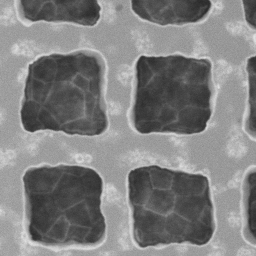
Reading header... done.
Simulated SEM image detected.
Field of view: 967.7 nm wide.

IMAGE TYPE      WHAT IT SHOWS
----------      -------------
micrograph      holes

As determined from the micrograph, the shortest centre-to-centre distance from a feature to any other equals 402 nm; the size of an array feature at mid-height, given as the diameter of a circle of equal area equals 327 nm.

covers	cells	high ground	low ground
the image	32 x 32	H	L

HHLLLLLLLLLLHHHHLLLLLLLLLLHHHHLL
HHLLLLLLLLLLHHHHHLLLLLLLLLHHHHHL
HHHHLLLLLLLLHHHHHHLLLLLLLHHHHHHL
HHHHHHHHHHHHHHHHHHHHHHHHHHHHHHHH
HHHHHHHHHHHHHHHHHHHHHHHHHHHHHHHH
HHHHHHHHHHHHHHHHHHHHHHHHHHHHHHHH
HHHHHHHHHLLHHHHHHHHHHHHHHHHHHHHH
HHHHHLLLLLLLLHHHHLLLLLLLLLHHHHHL
HHHHLLLLLLLLLHHHHLLLLLLLLLHHHHHL
HHHLLLLLLLLLLHHHHLLLLLLLLLLHHHHL
HHHLLLLLLLLLLHHHHLLLLLLLLLHHHHHL
HHHLLLLLLLLLLHHHHLLLLLLLLLHHHHHL
HHHLLLLLLLLLLHHHHLLLLLLLLLHHHHHL
HHHLLLLLLLLLLHHHHLLLLLLLLLHHHHHL
HHHLLLLLLLLLLHHHHLLLLLLLLLHHHHHL
HHHLLLLLLLLLLLHHHLLLLLLLLLHHHHHL
HHHHHHHHLLLLLHHHHLLLLLLLLHHHHHHL
HHHHHHHHHHHHHHHHHHHHHHHHHHHHHHHH
HHHHHHHHHHHHHHHHHHHHHHHHHHHHHHHH
HHHHHHHHHHHHHHHHHHHHHHHHHHHHHHHH
HHHHHHHHHHHHHHHHHHHHHHHHHHHHHHHH
HHHLLLLLLLLLHHHHLLLLLLLHHHHHHHHL
HHHLLLLLLLLLLHHHLLLLLLLLLLHHHHHL
HHHLLLLLLLLLLHHHLLLLLLLLLLHHHHLL
HHHLLLLLLLLLLHHHLLLLLLLLLLHHHHLL
HHHLLLLLLLLLLHHHLLLLLLLLLLLHHHHL
HHHLLLLLLLLLLHHHHLLLLLLLLLLHHHHL
HHHHLLLLLLLLLHHHHLLLLLLLLLLHHHHL
HHHHLLLLLLLLLHHHHLLLLLLLLLLHHHHL
HHHHLLLLLLLLLHHHHLLLLLLLLLLHHHLL
HHHHHLLLLLLLHHHHHLLLHHHHLLHHHHHH
HHHHHHHHHHHHHHHHHHHHHHHHHHHHHHHH